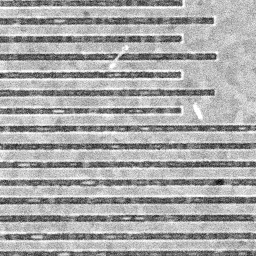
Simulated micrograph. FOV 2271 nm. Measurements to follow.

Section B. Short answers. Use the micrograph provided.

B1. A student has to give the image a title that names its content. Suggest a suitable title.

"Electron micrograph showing parallel lines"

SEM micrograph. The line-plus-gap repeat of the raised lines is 0.159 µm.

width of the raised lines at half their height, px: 9.88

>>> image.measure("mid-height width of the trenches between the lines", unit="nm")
69.8